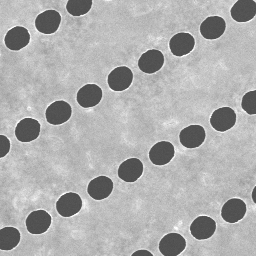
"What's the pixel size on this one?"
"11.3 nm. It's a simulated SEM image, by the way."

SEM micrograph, a regular array of holes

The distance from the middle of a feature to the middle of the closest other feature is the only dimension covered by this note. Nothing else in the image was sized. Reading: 397 nm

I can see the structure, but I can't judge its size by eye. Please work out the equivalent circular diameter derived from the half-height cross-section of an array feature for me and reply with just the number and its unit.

279 nm